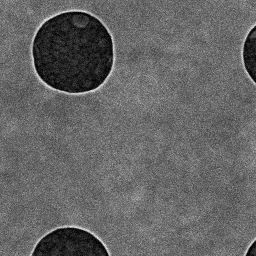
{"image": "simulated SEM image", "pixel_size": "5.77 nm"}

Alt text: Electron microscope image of holes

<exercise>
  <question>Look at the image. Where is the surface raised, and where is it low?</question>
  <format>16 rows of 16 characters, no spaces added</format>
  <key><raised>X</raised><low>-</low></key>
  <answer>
XXXXXXXXXXXXXXXX
XXX---XXXXXXXXXX
XX-----XXXXXXXX-
XX-----XXXXXXXX-
XX-----XXXXXXXX-
XXX---XXXXXXXXXX
XXXXXXXXXXXXXXXX
XXXXXXXXXXXXXXXX
XXXXXXXXXXXXXXXX
XXXXXXXXXXXXXXXX
XXXXXXXXXXXXXXXX
XXXXXXXXXXXXXXXX
XXXXXXXXXXXXXXXX
XXXXXXXXXXXXXXXX
XXX--XXXXXXXXXXX
XX-----XXXXXXXXX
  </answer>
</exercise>